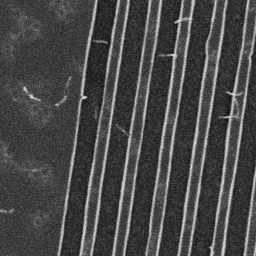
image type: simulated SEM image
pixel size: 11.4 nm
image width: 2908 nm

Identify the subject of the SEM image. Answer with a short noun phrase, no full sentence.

parallel lines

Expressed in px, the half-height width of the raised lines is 11.6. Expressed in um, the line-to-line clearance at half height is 0.242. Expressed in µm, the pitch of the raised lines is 0.368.